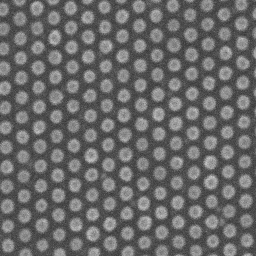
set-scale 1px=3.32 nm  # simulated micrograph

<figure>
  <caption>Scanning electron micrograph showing a regular array of raised bodies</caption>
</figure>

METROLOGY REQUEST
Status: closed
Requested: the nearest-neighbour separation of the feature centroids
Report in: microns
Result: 0.0643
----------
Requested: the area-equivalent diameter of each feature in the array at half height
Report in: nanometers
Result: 39.2